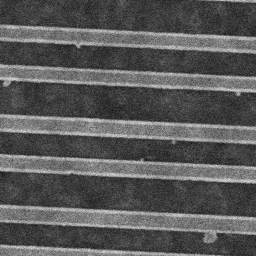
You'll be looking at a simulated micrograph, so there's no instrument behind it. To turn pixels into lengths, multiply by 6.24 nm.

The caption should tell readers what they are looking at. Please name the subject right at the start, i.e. parallel lines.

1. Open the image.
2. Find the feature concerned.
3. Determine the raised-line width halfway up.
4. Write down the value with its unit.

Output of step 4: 89.6 nm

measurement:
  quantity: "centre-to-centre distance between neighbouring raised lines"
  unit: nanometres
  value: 282